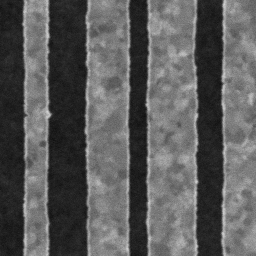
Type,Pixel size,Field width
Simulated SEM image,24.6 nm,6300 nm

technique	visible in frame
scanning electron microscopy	one or a few lines or trenches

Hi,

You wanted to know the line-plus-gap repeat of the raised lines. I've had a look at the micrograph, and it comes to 1670 nm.